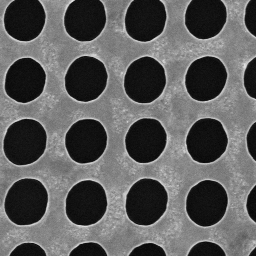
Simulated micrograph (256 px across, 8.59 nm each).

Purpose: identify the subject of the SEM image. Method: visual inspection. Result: a regular array of holes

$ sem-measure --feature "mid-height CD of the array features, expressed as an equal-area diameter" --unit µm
0.377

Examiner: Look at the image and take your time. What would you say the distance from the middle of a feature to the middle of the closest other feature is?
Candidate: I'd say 0.514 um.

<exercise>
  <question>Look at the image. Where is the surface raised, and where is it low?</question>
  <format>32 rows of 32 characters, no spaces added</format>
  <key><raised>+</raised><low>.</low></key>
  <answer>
+....++++....+++....++++....+++.
+.....++.....+++.....++.....+++.
+.....++.....+++.....++.....+++.
+....+++.....+++.....++.....+++.
+....++++...++++....++++...+++++
++++++++++++++++++++++++++++++++
++++++++++++++++++++++++++++++++
++..+++++...+++++..++++++..++++.
+....++++....+++....++++....+++.
+.....++.....+++.....++.....+++.
+.....++.....++......++.....+++.
+....+++.....+++....+++.....+++.
++..++++++..+++++..++++++.++++++
++++++++++++++++++++++++++++++++
++++++++++++++++++++++++++++++++
++...++++....++++...++++....++++
+.....++.....+++.....+++....+++.
+.....++.....+++.....++.....+++.
......++.....+++.....++.....+++.
+....++++....+++....++++....+++.
++..++++++++++++++++++++++++++++
++++++++++++++++++++++++++++++++
++...++++++++++++..+++++++++++++
+.....+++....+++.....+++....++++
+.....++.....+++.....++.....+++.
+.....++.....+++.....++.....+++.
+.....++.....+++.....++.....+++.
+....++++...++++....++++....++++
++++++++++++++++++++++++++++++++
++++++++++++++++++++++++++++++++
+++.++++++..++++++.++++++..+++++
+.....+++....+++.....+++....+++.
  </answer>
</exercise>